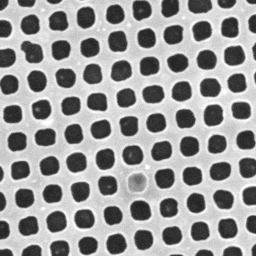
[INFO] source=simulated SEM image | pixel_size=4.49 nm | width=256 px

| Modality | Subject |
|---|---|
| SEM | a regular array of holes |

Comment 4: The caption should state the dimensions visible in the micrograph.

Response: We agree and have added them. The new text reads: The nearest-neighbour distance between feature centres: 123 nanometres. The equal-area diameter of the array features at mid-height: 0.0942 microns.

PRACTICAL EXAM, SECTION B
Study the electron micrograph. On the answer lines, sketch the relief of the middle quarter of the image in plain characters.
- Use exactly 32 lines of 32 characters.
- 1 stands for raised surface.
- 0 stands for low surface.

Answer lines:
11111000011100000110000011000001
00111000011100000110000011100011
00011000001100000110000111111111
00011000001100001111111111111111
00011000011110111111111111110001
00111111111111111111100011100000
11111111111111000111000001100000
11111110001110000010000001100000
00001100000110000011000001100000
00001100000110000011000011110111
00001100000111000111111111111111
00001110000111111111111111111000
00011111111111111111110001110000
11111111111111000001100001110000
11111110000111000001000000110000
10001110000011000001000000110000
00000100000011000001100001111111
00000110000011000011111111111111
00000110001111111111111111111100
10001111111111111111111000111000
11111111111111100001110000011000
11111111100011100000110000011000
11000111000001000000110000011000
10000011000001100000110000011111
00000011000001100000111111111111
10000011000011111111111111111111
10000111100111111111111000011100
11111111111111111111111000001100
11111111100001111111111000001100
11100011000001111111111000001100
11000011000001111111111000011111
11000001100001111111111111111111